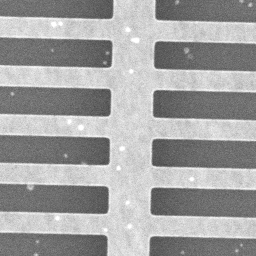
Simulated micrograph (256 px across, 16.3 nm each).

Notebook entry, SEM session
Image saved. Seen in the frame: groups of lines, slits or small figures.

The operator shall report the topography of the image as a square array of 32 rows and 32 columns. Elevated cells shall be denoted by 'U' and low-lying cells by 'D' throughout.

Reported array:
DDDDDDDDDDDDDDUUUUUDDDDDDDDDDDDD
DDDDDDDDDDDDDDUUUUUDDDDDDDDDDDDD
UUUUUUUUUUUUUUUUUUUUDDDDDDDDDDDD
UUUUUUUUUUUUUUUUUUUUUUUUUUUUUUUU
UUUUUUUUUUUUUUUUUUUUUUUUUUUUUUUU
DDDDDDDDDDDDDDUUUUUDDDDDDDDDDDDD
DDDDDDDDDDDDDDUUUUUDDDDDDDDDDDDD
DDDDDDDDDDDDDDUUUUUDDDDDDDDDDDDD
UUUUUUUUUUDDDUUUUUUUDDDDDDDDDDDD
UUUUUUUUUUUUUUUUUUUUUUUUUUUUUUUU
UUUUUUUUUUUUUUUUUUUUUUUUUUUUUUUU
DDDDDDDDDDDDDDUUUUUDDDDDDDDDDDDD
DDDDDDDDDDDDDDUUUUUDDDDDDDDDDDDD
DDDDDDDDDDDDDDUUUUUDDDDDDDDDDDDD
UUUUUDDDDDDDDDUUUUUDDDDDDDDDDDDD
UUUUUUUUUUUUUUUUUUUUUUUUUUUUUUUU
UUUUUUUUUUUUUUUUUUUUUUUUUUUUUUUU
DDDDDDDDDDDDDDUUUUUDDDDDDDDDDDUU
DDDDDDDDDDDDDDUUUUUDDDDDDDDDDDDD
DDDDDDDDDDDDDDUUUUUDDDDDDDDDDDDD
UUUUDDDDDDDDDUUUUUUDDDDDDDDDDDDD
UUUUUUUUUUUUUUUUUUUUUUUUUUUUUUUU
UUUUUUUUUUUUUUUUUUUUUUUUUUUUUUUU
DDDDDDDDDDDDDUUUUUUDDDDDDUUUUUUU
DDDDDDDDDDDDDDUUUUUDDDDDDDDDDDDD
DDDDDDDDDDDDDDUUUUUDDDDDDDDDDDDD
DDDDDDDDDDDDDUUUUUUDDDDDDDDDDDDD
UUUUUUUUUUUUUUUUUUUUUUUUUUUUUUUU
UUUUUUUUUUUUUUUUUUUUUUUUUUUUUUUU
DDDDDDDDDDDDDUUUUUUDDDDDDUUUUUUU
DDDDDDDDDDDDDDUUUUUDDDDDDDDDDDDD
DDDDDDDDDDDDDDUUUUUDDDDDDDDDDDDD